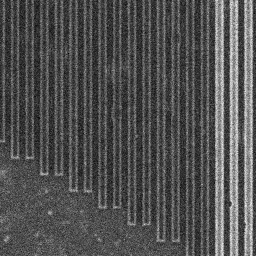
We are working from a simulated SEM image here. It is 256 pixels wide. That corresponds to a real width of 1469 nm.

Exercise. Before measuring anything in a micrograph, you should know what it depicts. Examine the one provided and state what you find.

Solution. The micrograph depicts parallel lines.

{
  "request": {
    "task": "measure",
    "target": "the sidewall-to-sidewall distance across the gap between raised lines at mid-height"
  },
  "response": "45.2 nm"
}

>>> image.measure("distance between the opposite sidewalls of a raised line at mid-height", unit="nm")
39.5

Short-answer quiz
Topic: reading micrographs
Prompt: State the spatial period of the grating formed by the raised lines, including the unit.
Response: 83.9 nm